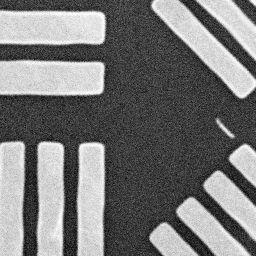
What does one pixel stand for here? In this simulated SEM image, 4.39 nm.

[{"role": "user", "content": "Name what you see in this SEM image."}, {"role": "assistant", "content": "groups of lines, slits or small figures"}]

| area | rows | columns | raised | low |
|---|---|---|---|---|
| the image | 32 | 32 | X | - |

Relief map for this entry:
-------------------XXXX--XXXX---
X-------------------XXXX--XXXX--
XXXXXXXXXXXXX--------XXXX---XXX-
XXXXXXXXXXXXX---------XXX----XXX
XXXXXXXXXXXXX----------XXX----XX
------------------------XXX---XX
------------------------XXXX---X
-------------------------XXXX---
XXXXXXXXXXXXX-------------XXXX--
XXXXXXXXXXXXX---------------XXX-
XXXXXXXXXXXXX---------------XXXX
XXXXXXXXXXXX-----------------XX-
--------------------------------
--------------------------------
--------------------------------
--------------------------------
--------------------------------
--------------------------------
XXX--XXX--XXX-----------------X-
XXX--XXX--XXX----------------XXX
XXX--XXX--XXX----------------XXX
XXX--XXX--XXX-----------------XX
XXX--XXX--XXX-------------XXX--X
XXX--XXX--XXX-------------XXXX--
XXX--XXX--XXX-------------XXXXX-
XXX--XXX--XXX----------XX--XXXX-
XXX--XXX--XXX---------XXXX--XXXX
XXX--XXX--XXX----------XXXX---XX
XXX--XXX--XXX-------X---XXXX---X
XXX--XXX--XXX------XXX---XXXX---
XXX--XXX--XXX------XXXX---XXXX--
XXX--XXX--XXX-------XXXX---XXXX-